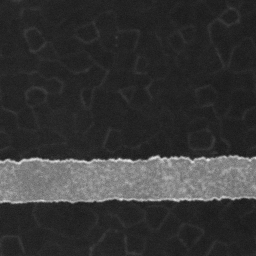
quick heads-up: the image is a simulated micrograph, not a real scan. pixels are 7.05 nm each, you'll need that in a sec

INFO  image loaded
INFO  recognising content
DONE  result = one or a few lines or trenches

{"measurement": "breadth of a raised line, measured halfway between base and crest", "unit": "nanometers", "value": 288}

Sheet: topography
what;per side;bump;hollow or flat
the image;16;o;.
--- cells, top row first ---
................
................
................
................
................
................
................
................
................
................
oooooooooooooooo
oooooooooooooooo
ooooooo.oo.o....
................
................
................